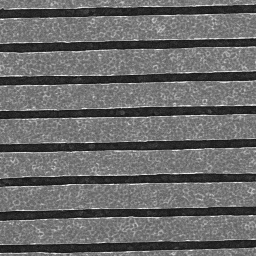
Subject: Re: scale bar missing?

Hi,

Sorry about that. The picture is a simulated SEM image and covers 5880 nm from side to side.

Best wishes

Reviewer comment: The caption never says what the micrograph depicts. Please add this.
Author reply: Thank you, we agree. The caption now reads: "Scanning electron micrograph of parallel lines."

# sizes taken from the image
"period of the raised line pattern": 771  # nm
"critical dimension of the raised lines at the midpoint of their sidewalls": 568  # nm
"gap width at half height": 8.75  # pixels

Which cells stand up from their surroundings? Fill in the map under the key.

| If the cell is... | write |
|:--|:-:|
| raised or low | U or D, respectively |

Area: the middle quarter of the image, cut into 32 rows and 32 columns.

UUUUUUUUUUUUUUUUUUUUUUUUUUUUUUUU
UUUUUUUUUUUUUUUUUUUUUUUUUUUUUUUU
UUUUUUUUUUUUUUUUUUUUUDDDDDDDDDDD
DDDDDDDDDDDDDDDDDDDDDDDDDDDDDDDD
DDDDDDDDDDDDDDDDDDDDDDDDDDDDDDUU
UUUUUUUUUUUUUUUUUUUUUUUUUUUUUUUU
UUUUUUUUUUUUUUUUUUUUUUUUUUUUUUUU
UUUUUUUUUUUUUUUUUUUUUUUUUUUUUUUU
UUUUUUUUUUUUUUUUUUUUUUUUUUUUUUUU
UUUUUUUUUUUUUUUUUUUUUUUUUUUUUUUU
UUUUUUUUUUUUUUUUUUUUUUUUUUUUUDDD
DDDDDDDDDDDDDDDDDDDDDDDDDDDDDDDD
DDDDDDDDDDDDDDDDDDDDDDDDDDDDDDDD
DUDDDDUUUUUUUUUUUUUUUUUUUUUUUUUU
UUUUUUUUUUUUUUUUUUUUUUUUUUUUUUUU
UUUUUUUUUUUUUUUUUUUUUUUUUUUUUUUU
UUUUUUUUUUUUUUUUUUUUUUUUUUUUUUUU
UUUUUUUUUUUUUUUUUUUUUUUUUUUUUUUU
UUUUUUUUUUUUUUUUUUUUUUUUUUUUUUUU
UUUUUUUUUUUUDDDDDDDDDDDDDDDDDDDD
DDDDDDUDDDDDDDDDDDDDDDDDDDDDDDDD
DDDDDDDDDDDDDDDDDDDDDDDDDDDDDDUU
UUUUUUUUUUUUUUUUUUUUUUUUUUUUUUUU
UUUUUUUUUUUUUUUUUUUUUUUUUUUUUUUU
UUUUUUUUUUUUUUUUUUUUUUUUUUUUUUUU
UUUUUUUUUUUUUUUUUUUUUUUUUUUUUUUU
UUUUUUUUUUUUUUUUUUUUUUUUUUUUUUUU
UUUUUUUUUUUUUUUUUUUUUUUUDDDDDDDD
DDDDDDDDDDDDDDDDDDDDDDDDDDDDDDDD
DDDDDDDDDDDDDDDDDDDDDDDDDDDDDDDD
UUUUUUUUUUUUUUUUUUUUUUUUUUUUUUUU
UUUUUUUUUUUUUUUUUUUUUUUUUUUUUUUU